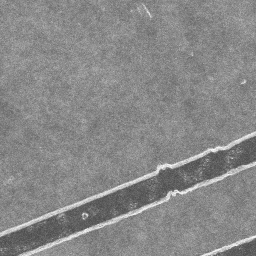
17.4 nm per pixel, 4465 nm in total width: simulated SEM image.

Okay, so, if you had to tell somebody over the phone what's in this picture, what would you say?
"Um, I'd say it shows one or a few lines or trenches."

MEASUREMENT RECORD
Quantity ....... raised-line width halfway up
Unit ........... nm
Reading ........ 513